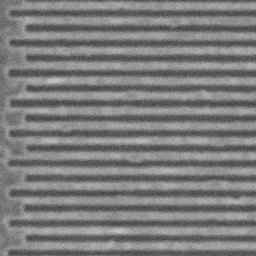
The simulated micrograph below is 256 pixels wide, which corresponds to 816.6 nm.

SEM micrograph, parallel lines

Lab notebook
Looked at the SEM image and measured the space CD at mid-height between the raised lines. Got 25.9 nm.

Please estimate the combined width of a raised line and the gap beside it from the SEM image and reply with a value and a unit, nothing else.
47.9 nm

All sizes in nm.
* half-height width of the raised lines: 23.1